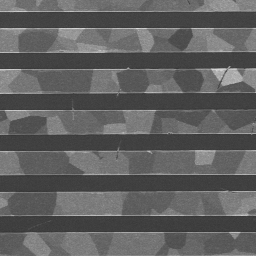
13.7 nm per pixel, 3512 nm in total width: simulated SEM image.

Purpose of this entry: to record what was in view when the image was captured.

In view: parallel lines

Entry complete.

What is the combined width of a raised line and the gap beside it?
0.56 um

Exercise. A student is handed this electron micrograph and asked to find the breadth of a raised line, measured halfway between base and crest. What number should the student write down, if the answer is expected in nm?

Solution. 329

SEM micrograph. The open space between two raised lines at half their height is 0.228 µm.